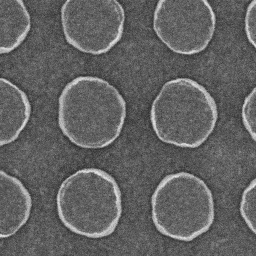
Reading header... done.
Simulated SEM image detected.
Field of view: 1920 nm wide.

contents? raised bodies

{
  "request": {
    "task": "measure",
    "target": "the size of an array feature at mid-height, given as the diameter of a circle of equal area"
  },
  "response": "487 nm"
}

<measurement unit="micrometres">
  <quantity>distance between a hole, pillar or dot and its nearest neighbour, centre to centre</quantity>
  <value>0.681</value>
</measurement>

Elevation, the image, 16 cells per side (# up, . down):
#...####..###...
##..####..###..#
#...###...###...
................
................
#...###...###...
##..####..###..#
##..####..###..#
#...###...###...
................
................
#...###...###...
##..###...###..#
##..###...###..#
#....##...##....
................